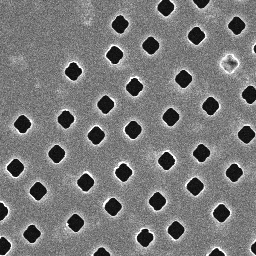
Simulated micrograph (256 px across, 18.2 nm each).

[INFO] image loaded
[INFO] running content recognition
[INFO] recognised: a regular array of holes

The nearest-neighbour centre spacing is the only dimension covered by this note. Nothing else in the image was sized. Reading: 36 px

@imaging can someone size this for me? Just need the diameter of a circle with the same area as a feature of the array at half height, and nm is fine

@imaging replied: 302